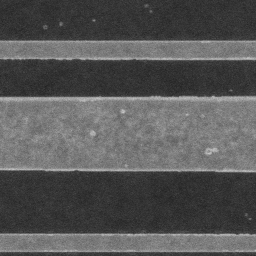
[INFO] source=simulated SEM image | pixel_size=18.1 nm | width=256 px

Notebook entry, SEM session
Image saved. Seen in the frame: lines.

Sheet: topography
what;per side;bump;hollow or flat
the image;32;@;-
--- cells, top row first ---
--------------------------------
--------------------------------
--------------------------------
--------------------------------
--------------------------------
@@@@@@@@@@@@@@@@@@@@@@@@@@@@@@@@
@@@@@@@@@@@@@@@@@@@@@@@@@@@@@@@@
--------------------------------
--------------------------------
--------------------------------
--------------------------------
--------------------------------
@@@@@@@@@@@@@@@@@@@@@@@@@@@@@@@@
@@@@@@@@@@@@@@@@@@@@@@@@@@@@@@@@
@@@@@@@@@@@@@@@@@@@@@@@@@@@@@@@@
@@@@@@@@@@@@@@@@@@@@@@@@@@@@@@@@
@@@@@@@@@@@@@@@@@@@@@@@@@@@@@@@@
@@@@@@@@@@@@@@@@@@@@@@@@@@@@@@@@
@@@@@@@@@@@@@@@@@@@@@@@@@@@@@@@@
@@@@@@@@@@@@@@@@@@@@@@@@@@@@@@@@
@@@@@@@@@@@@@@@@@@@@@@@@@@@@@@@@
--------------------------------
--------------------------------
--------------------------------
--------------------------------
--------------------------------
--------------------------------
--------------------------------
--------------------------------
@@@@@@@@@@@@@@@@@@@@@@@@@@@@@@@@
@@@@@@@@@@@@@@@@@@@@@@@@@@@@@@@@
--------------------------------